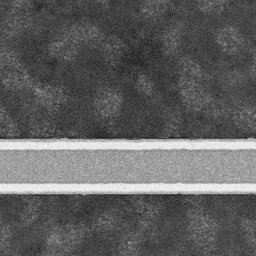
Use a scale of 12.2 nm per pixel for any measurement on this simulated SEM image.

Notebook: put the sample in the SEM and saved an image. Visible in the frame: one or a few lines or trenches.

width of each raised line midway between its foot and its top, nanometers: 525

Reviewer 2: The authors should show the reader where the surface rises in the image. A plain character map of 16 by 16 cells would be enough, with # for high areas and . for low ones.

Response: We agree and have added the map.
................
................
................
................
................
................
................
................
................
################
################
################
................
................
................
................